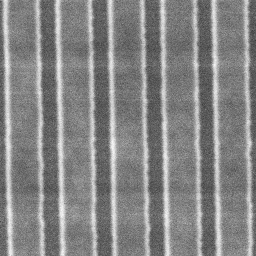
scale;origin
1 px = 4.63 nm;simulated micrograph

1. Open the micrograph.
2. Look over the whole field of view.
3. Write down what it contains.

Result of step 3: lines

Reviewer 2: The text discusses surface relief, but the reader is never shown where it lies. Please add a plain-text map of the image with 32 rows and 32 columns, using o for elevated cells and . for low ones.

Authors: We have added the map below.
.oooo..oooo...oooo..oooo...oooo.
.oooo..oooo...oooo..ooooo..oooo.
.oooo..oooo...oooo..ooooo..oooo.
.oooo..oooo...oooo..ooooo..oooo.
.oooo..oooo...oooo..ooooo..oooo.
.oooo..oooo...oooo..ooooo..oooo.
.oooo..oooo...oooo..ooooo..oooo.
.oooo..oooo...oooo..ooooo..oooo.
.oooo..ooooo..oooo..ooooo..oooo.
.oooo..ooooo..oooo..ooooo..oooo.
.oooo..ooooo..oooo..ooooo..oooo.
.oooo..ooooo..oooo..ooooo..oooo.
.oooo..ooooo..oooo..ooooo..oooo.
.oooo..ooooo..oooo..ooooo..oooo.
.oooo..ooooo..oooo..ooooo..oooo.
.oooo...oooo..oooo..ooooo..oooo.
.oooo...oooo..oooo..ooooo..oooo.
.oooo...oooo..oooo..ooooo..oooo.
.oooo...oooo..oooo...oooo..oooo.
.oooo...oooo..oooo...oooo..oooo.
.oooo...oooo..oooo...oooo..oooo.
.oooo...oooo..oooo...oooo..oooo.
.oooo...oooo..oooo...oooo..oooo.
.oooo...oooo..oooo...oooo..oooo.
.oooo...oooo..ooooo..oooo..oooo.
.oooo...oooo..oooo...oooo..oooo.
.oooo...oooo..oooo...oooo..oooo.
.oooo...oooo..oooo...oooo..oooo.
.oooo...oooo..ooooo..oooo..oooo.
.oooo...oooo..ooooo..oooo..oooo.
.oooo...oooo..ooooo..oooo..oooo.
.oooo...oooo..ooooo..oooo..oooo.